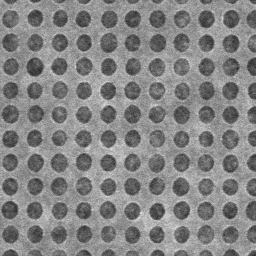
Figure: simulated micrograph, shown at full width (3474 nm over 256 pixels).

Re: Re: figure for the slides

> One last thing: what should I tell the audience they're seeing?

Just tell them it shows a regular array of holes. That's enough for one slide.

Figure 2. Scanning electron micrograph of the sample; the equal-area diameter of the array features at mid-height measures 18 px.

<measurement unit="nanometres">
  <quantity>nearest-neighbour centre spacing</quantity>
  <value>322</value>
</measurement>